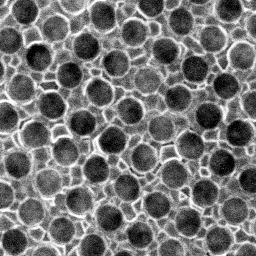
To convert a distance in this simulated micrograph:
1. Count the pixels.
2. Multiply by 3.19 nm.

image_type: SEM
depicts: a regular array of raised bodies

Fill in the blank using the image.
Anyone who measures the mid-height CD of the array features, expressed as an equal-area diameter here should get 0.0901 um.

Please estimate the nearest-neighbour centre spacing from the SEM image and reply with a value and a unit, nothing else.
108 nm